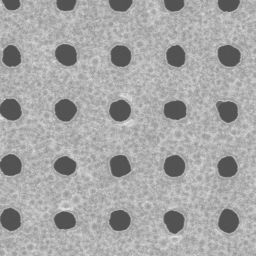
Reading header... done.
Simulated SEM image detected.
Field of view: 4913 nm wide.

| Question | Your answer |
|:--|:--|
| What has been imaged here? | a regular array of holes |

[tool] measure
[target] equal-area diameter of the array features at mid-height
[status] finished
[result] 416 nm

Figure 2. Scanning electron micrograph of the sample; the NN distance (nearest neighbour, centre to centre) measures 54.3 pixels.